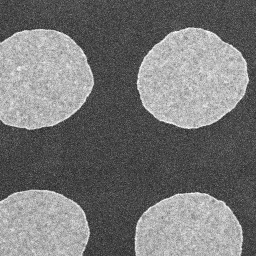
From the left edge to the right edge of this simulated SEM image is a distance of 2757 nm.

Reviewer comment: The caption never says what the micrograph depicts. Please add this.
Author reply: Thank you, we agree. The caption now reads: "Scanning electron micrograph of raised bodies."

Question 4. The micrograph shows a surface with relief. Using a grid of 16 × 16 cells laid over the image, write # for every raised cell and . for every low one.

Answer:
................
................
####......####..
#####....######.
######...######.
######...######.
#####....######.
####......####..
................
................
................
................
####......####..
#####....######.
######...######.
#####...#######.